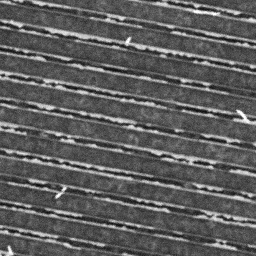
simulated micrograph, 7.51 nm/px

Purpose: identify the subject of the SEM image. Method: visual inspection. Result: parallel lines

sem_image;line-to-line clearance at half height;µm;0.128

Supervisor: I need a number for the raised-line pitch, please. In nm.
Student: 190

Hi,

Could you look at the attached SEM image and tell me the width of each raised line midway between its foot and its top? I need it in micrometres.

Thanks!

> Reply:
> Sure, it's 0.06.